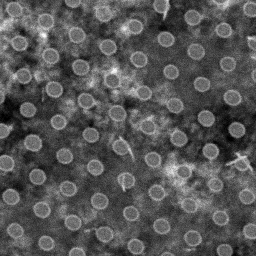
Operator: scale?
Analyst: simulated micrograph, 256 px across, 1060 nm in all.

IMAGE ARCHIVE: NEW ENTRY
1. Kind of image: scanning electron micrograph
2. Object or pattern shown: a regular array of raised bodies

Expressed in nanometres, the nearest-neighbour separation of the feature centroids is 136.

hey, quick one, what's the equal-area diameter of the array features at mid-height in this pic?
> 61.4 nm